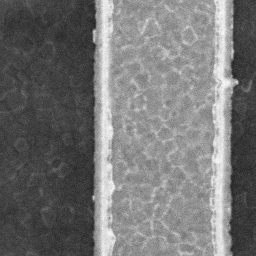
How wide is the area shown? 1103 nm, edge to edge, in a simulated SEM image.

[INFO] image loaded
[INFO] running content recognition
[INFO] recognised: one or a few lines or trenches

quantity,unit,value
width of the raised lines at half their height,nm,502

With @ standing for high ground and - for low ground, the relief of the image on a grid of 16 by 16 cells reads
-------@@@@@@@--
-------@@@@@@@--
-------@@@@@@@--
-------@@@@@@@--
-------@@@@@@@--
-------@@@@@@@--
-------@@@@@@@--
-------@@@@@@@--
-------@@@@@@@--
-------@@@@@@@--
-------@@@@@@@--
-------@@@@@@@--
-------@@@@@@@--
-------@@@@@@@--
-------@@@@@@@--
-------@@@@@@@--